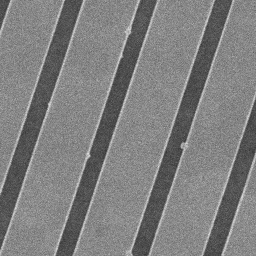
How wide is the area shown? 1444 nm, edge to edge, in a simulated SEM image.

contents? one or a few lines or trenches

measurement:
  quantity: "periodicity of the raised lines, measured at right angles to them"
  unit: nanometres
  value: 398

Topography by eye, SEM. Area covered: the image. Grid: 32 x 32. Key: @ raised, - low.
-@@@@@@@--@@@@@@@---@@@@@@@--@@@
-@@@@@@@--@@@@@@@--@@@@@@@---@@@
-@@@@@@---@@@@@@@--@@@@@@@--@@@@
@@@@@@@--@@@@@@@---@@@@@@@--@@@@
@@@@@@@--@@@@@@@--@@@@@@@---@@@@
@@@@@@---@@@@@@@--@@@@@@@--@@@@@
@@@@@@--@@@@@@@---@@@@@@@--@@@@@
@@@@@@--@@@@@@@--@@@@@@@---@@@@@
@@@@@---@@@@@@@--@@@@@@@--@@@@@@
@@@@@--@@@@@@@---@@@@@@@--@@@@@@
@@@@@--@@@@@@@--@@@@@@@---@@@@@@
@@@@---@@@@@@@--@@@@@@@--@@@@@@@
@@@@--@@@@@@@---@@@@@@@--@@@@@@@
@@@@--@@@@@@@--@@@@@@@---@@@@@@-
@@@---@@@@@@@--@@@@@@@--@@@@@@@-
@@@--@@@@@@@---@@@@@@@--@@@@@@@-
@@@--@@@@@@@--@@@@@@@---@@@@@@--
@@---@@@@@@@--@@@@@@@--@@@@@@@--
@@--@@@@@@@---@@@@@@@--@@@@@@@--
@@--@@@@@@@--@@@@@@@---@@@@@@---
@---@@@@@@@--@@@@@@@--@@@@@@@---
@--@@@@@@@---@@@@@@@--@@@@@@@--@
@--@@@@@@@--@@@@@@@---@@@@@@---@
---@@@@@@@--@@@@@@@--@@@@@@@---@
--@@@@@@@---@@@@@@@--@@@@@@@--@@
--@@@@@@@--@@@@@@@---@@@@@@---@@
--@@@@@@@--@@@@@@@--@@@@@@@---@@
-@@@@@@@---@@@@@@@--@@@@@@@--@@@
-@@@@@@@--@@@@@@@---@@@@@@---@@@
-@@@@@@@--@@@@@@@--@@@@@@@---@@@
@@@@@@@---@@@@@@@--@@@@@@@--@@@@
@@@@@@@--@@@@@@@---@@@@@@---@@@@